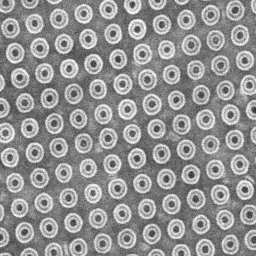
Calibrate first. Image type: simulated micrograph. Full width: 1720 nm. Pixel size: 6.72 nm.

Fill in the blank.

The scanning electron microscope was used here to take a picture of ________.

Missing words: a regular array of ring-shaped raised bodies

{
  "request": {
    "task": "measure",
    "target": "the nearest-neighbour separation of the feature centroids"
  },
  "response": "166 nm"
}